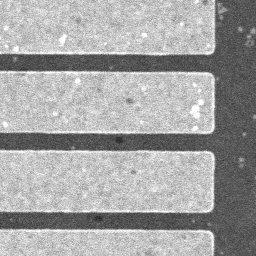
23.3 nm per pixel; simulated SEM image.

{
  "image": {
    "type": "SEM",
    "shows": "wiring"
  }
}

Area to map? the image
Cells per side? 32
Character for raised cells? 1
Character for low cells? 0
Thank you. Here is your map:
11111111111111111111111111100000
11111111111111111111111111100000
11111111111111111111111111100000
11111111111111111111111111100000
11111111111111111111111111100000
11111111111111111111111111100000
11111111111111111111111111000000
00000000000000000000000000000000
00000000000000000000000000000000
11111111111111111111111111100000
11111111111111111111111111100000
11111111111111111111111111100000
11111111111111111111111111100000
11111111111111111111111111100000
11111111111111111111111111100000
11111111111111111111111111100000
11111111111111111111111111000000
00000000000000000000000000000000
00000000000000000000000000000000
11111111111111111111111111100000
11111111111111111111111111100000
11111111111111111111111111100000
11111111111111111111111111100000
11111111111111111111111111100000
11111111111111111111111111100000
11111111111111111111111111100000
00000000000000000000111111000000
00000000000000000000000000000000
00000000000000000000000000000000
11111111111111111111111111100000
11111111111111111111111111100000
11111111111111111111111111100000